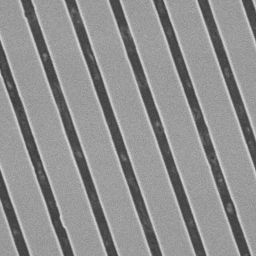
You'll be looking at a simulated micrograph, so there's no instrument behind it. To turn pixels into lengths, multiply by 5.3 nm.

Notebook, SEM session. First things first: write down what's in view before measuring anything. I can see parallel lines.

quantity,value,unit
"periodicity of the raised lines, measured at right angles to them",0.222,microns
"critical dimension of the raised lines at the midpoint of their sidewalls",169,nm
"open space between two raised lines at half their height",0.0521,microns